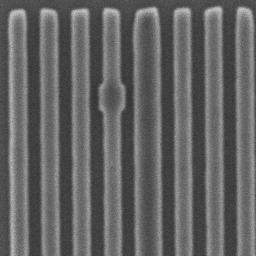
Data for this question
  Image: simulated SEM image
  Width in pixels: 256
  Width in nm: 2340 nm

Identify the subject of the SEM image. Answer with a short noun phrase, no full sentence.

wiring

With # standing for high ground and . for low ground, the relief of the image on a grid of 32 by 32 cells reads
................................
..#..##..##..##..###..##..##..#.
.##..##..##..##..###..##..##..##
.##..##..##..##..###..##..##..##
.##..##..##..##..###..##..##..##
.##..##..##..##..###..##..##..##
.##..##..##..##..###..##..##..##
.##..##..##..##..###..##..##..##
.##..##..##..##..###..##..##..##
.##..##..##..##..###..##..##..##
.##..##..##..##..###..##..##..##
.##..##..##.####.###..##..##..##
.##..##..##.####.###..##..##..##
.##..##..##.###..###..##..##..##
.##..##..##..##..###..##..##..##
.##..##..##..##..###..##..##..##
.##..##..##..##..###..##..##..##
.##..##..##..##..###..##..##..##
.##..##..##..##..###..##..##..##
.##..##..##..##..###..##..##..##
.##..##..##..##..###..##..##..##
.##..##..##..##..###..##..##..##
.##..##..##..##..###..##..##..##
.##..##..##..##..###..##..##..##
.##..##..##..##..###..##..##..##
.##..##..##..##..###..##..##..##
.##..##..##..##..###..##..##..##
.##..##..##..##..###..##..##..##
.##..##..##..##..###..##..##..##
.##..##..##..##..###..##..##..##
..#..##..##..##..###..##..##..##
..#..##..##..##..###..##..##..##